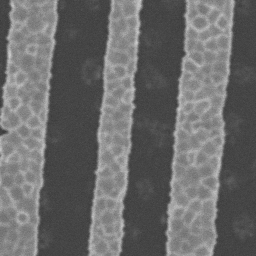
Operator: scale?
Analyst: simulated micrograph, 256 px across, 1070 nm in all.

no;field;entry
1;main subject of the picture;one or a few lines or trenches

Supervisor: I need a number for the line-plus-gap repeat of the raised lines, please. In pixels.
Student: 86